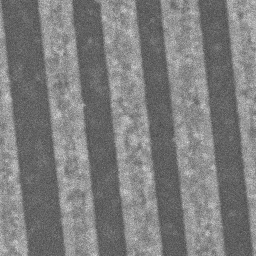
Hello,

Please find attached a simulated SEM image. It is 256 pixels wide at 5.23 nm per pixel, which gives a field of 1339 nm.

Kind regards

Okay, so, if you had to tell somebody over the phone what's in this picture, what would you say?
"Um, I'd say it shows one or a few lines or trenches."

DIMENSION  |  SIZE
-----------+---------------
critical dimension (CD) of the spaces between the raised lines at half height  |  191 nanometres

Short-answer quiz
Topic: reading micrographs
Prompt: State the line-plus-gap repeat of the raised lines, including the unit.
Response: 324 nm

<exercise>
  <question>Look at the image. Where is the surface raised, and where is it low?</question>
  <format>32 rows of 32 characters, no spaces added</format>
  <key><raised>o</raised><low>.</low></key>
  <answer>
.....ooo.....ooo.....ooo.....ooo
.....oooo....oooo....ooo.....ooo
......ooo....oooo....ooo.....ooo
......ooo....oooo....ooo.....ooo
......ooo.....ooo....oooo....ooo
......ooo.....ooo....oooo....ooo
......ooo.....ooo....oooo.....oo
......ooo.....ooo.....ooo.....oo
......ooo.....ooo.....ooo.....oo
o.....ooo.....ooo.....ooo.....oo
o.....oooo....ooo.....ooo.....oo
o......ooo....ooo.....ooo.....oo
o......ooo....oooo....ooo.....oo
o......ooo.....ooo....oooo....oo
o......ooo.....ooo....oooo....oo
o......ooo.....ooo....oooo.....o
o......ooo.....ooo....oooo.....o
o......ooo.....ooo.....ooo.....o
oo.....ooo.....ooo.....ooo.....o
oo.....ooo.....ooo.....ooo.....o
oo......ooo....ooo.....ooo.....o
oo......ooo....oooo....ooo.....o
oo......ooo....oooo....oooo....o
oo......ooo.....ooo....oooo....o
oo......ooo.....ooo....oooo.....
oo......ooo.....ooo....oooo.....
oo......ooo.....ooo.....ooo.....
oo......ooo.....ooo.....ooo.....
ooo.....ooo.....ooo.....ooo.....
ooo.....oooo....ooo.....ooo.....
ooo......ooo....oooo....ooo.....
ooo......ooo....oooo....ooo.....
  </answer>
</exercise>